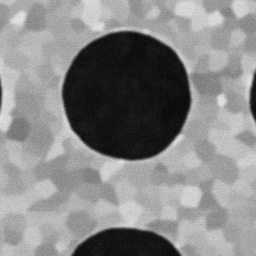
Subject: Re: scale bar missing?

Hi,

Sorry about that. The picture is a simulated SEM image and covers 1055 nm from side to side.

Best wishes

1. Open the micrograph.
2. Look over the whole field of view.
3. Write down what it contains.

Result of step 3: holes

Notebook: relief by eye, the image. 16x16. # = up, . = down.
################
################
######....######
#####......#####
####........####
####........####
####........####
####........####
#####......#####
######....######
################
################
################
################
######....######
#####......#####